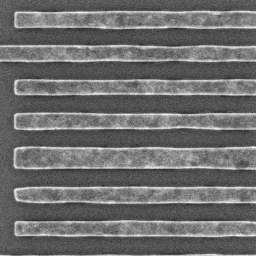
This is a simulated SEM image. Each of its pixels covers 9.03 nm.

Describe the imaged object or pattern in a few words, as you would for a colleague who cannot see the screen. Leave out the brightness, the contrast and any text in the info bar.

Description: wiring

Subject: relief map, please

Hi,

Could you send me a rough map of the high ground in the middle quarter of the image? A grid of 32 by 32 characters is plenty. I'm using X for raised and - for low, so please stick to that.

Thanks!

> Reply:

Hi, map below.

--------------------------------
--------------------------------
--------------------------------
--------------------------------
XXXXXXXXXXXXXXXXXXXXXXXXXXXXXXXX
XXXXXXXXXXXXXXXXXXXXXXXXXXXXXXXX
XXXXXXXXXXXXXXXXXXXXXXXXXXXXXXXX
XXXXXXX-------------------XXXXXX
--------------------------------
--------------------------------
--------------------------------
--------------------------------
XXXXXXXX------------------------
XXXXXXXXXXXXXXXXXXXXXXXXXXXXXXXX
XXXXXXXXXXXXXXXXXXXXXXXXXXXXXXXX
XXXXXXXXXXXXXXXXXXXXXXXXXXXXXXXX
--------------------------------
--------------------------------
--------------------------------
--------------------------------
--------------------------------
XXXXXXXXXXXXXXXXXXXXXXXXXXXXXXXX
XXXXXXXXXXXXXXXXXXXXXXXXXXXXXXXX
XXXXXXXXXXXXXXXXXXXXXXXXXXXXXXXX
XXXXXXXXXXXXXXXXXXXXXXXXXXXXXXXX
XXXXXXXXXXXXXXXXXXXXXXXXXXXXXXXX
--------------------------------
--------------------------------
--------------------------------
--------------------------------
--------------------------------
XXXXXXXXXXXXXXXXXXXXXXXXXXXXXXXX